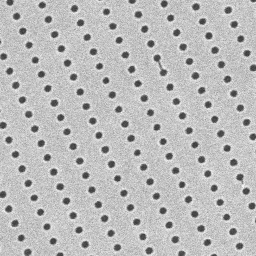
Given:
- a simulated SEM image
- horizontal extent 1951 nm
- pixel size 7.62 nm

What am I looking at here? a regular array of holes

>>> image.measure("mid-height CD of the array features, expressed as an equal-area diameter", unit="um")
0.0567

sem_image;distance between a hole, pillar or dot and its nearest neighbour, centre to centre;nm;119